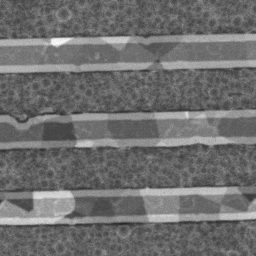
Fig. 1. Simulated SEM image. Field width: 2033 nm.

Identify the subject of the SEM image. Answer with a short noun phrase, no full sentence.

one or a few lines or trenches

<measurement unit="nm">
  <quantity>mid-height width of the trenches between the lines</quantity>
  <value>387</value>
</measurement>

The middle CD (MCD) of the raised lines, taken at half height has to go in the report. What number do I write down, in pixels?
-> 27.2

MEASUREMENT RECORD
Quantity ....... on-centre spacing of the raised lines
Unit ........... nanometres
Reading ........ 606